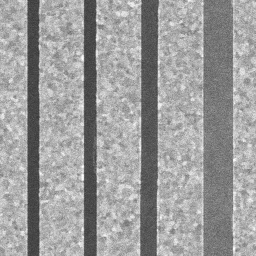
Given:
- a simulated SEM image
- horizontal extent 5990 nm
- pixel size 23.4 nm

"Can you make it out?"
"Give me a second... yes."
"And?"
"lines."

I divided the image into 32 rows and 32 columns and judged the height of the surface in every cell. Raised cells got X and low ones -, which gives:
XXX--XXXXX--XXXXXX--XXXXX----XXX
XXX--XXXXX--XXXXXX--XXXXX----XXX
XXX--XXXXX--XXXXXX--XXXXX----XXX
XXX--XXXXX--XXXXXX--XXXXX----XXX
XXX--XXXXX--XXXXXX--XXXXX----XXX
XXX--XXXXX--XXXXXX--XXXXX----XXX
XXX--XXXXX--XXXXXX--XXXXX----XXX
XXX--XXXXX--XXXXXX--XXXXX----XXX
XXX--XXXXX--XXXXXX--XXXXX----XXX
XXX--XXXXX--XXXXXX--XXXXX----XXX
XXX--XXXXX--XXXXXX--XXXXX----XXX
XXX--XXXXX--XXXXXX--XXXXX----XXX
XXX--XXXXX--XXXXXX--XXXXX----XXX
XXX--XXXXX--XXXXXX--XXXXX----XXX
XXX--XXXXX--XXXXXX--XXXXX----XXX
XXX--XXXXX--XXXXXX--XXXXX----XXX
XXX--XXXXX--XXXXXX--XXXXX----XXX
XXX--XXXXX--XXXXXX--XXXXX----XXX
XXX--XXXXX--XXXXXX--XXXXX----XXX
XXX--XXXXX--XXXXXX--XXXXX----XXX
XXX--XXXXX--XXXXXX--XXXXX----XXX
XXX--XXXXX--XXXXXX--XXXXX----XXX
XXX--XXXXX--XXXXXX--XXXXX----XXX
XXX--XXXXX--XXXXXX--XXXXX----XXX
XXX--XXXXX--XXXXX---XXXXX----XXX
XXX--XXXXX--XXXXX---XXXXX----XXX
XXX--XXXXX--XXXXX---XXXXX----XXX
XXX--XXXXX--XXXXX---XXXXX----XXX
XXX--XXXXX--XXXXX---XXXXX----XXX
XXX--XXXXX--XXXXX---XXXXX----XXX
XXX--XXXXX--XXXXX---XXXXX----XXX
XXX--XXXXX--XXXXX---XXXXX----XXX